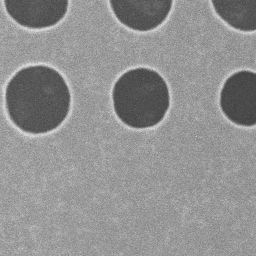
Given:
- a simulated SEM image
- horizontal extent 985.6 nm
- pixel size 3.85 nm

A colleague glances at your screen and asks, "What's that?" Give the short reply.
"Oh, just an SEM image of holes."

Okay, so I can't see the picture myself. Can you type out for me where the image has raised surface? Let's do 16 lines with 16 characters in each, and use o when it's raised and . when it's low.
....ooo....oo...
o..ooooo..oooo..
oooooooooooooooo
oooooooooooooooo
o...oooo..ooooo.
....ooo...oooo..
....ooo....ooo..
o...oooo..oooo..
oooooooooooooooo
oooooooooooooooo
oooooooooooooooo
oooooooooooooooo
oooooooooooooooo
oooooooooooooooo
oooooooooooooooo
oooooooooooooooo